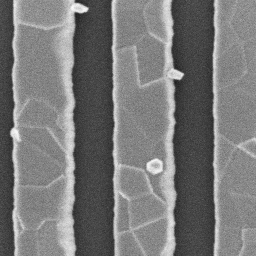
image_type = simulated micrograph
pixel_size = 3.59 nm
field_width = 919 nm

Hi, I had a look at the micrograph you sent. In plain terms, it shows lines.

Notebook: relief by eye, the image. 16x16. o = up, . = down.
.oooo..oooo..ooo
.oooo..oooo..ooo
.ooo...oooo..ooo
.ooo...oooo..ooo
.ooo...oooo..ooo
.ooo...oooo..ooo
.oooo..oooo..ooo
.oooo..oooo..ooo
.oooo..oooo..ooo
.oooo..oooo..ooo
.oooo..oooo..ooo
.oooo..oooo..ooo
.oooo..oooo..ooo
.ooo...oooo..ooo
.ooo...oooo..ooo
.oooo..oooo..ooo